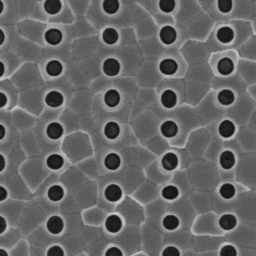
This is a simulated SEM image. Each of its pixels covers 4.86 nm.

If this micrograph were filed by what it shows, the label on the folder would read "a regular array of holes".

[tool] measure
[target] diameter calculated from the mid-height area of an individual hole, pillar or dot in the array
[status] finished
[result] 82.4 nm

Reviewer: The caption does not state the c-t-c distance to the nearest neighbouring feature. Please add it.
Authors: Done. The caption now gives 31 pixels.